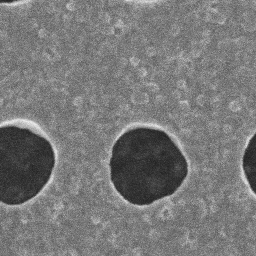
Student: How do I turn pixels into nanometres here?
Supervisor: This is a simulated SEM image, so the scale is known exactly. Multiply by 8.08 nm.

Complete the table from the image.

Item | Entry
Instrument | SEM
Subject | holes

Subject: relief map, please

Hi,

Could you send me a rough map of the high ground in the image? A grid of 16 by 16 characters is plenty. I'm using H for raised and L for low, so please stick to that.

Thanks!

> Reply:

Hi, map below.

HHHHHHHHHHHHHHHH
HHHHHHHHHHHHHHHH
HHHHHHHHHHHHHHHH
HHHHHHHHHHHHHHHH
HHHHHHHHHHHHHHHH
HHHHHHHHHHHHHHHH
HHHHHHHHHHHHHHHH
HHHHHHHHHHHHHHHH
LLLHHHHHLLLHHHHH
LLLHHHHLLLLHHHHL
LLLHHHHLLLLLHHHL
LLLHHHHLLLLHHHHH
LLHHHHHHLLHHHHHH
HHHHHHHHHHHHHHHH
HHHHHHHHHHHHHHHH
HHHHHHHHHHHHHHHH